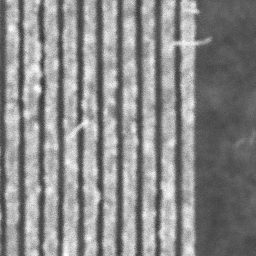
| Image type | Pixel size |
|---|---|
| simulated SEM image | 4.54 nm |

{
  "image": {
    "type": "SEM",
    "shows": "parallel lines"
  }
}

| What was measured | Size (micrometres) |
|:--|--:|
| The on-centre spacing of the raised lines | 0.0885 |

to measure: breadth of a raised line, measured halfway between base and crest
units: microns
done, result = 0.0539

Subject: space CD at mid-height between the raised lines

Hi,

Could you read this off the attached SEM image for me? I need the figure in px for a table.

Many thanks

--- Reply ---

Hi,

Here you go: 8.13